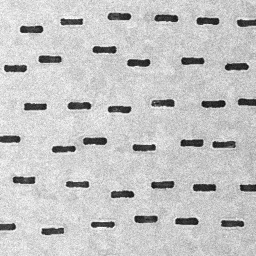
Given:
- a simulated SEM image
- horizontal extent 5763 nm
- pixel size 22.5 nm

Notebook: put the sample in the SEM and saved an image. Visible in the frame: a regular array of holes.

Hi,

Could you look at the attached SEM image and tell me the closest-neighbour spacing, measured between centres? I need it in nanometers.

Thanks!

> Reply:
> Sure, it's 855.